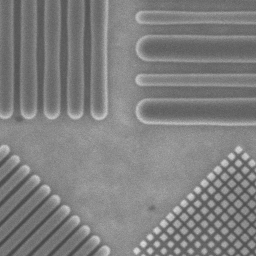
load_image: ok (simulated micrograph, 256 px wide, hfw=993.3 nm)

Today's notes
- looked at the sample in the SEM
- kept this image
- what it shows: groups of lines, slits or small figures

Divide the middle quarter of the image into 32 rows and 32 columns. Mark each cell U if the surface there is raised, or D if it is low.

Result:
DUUUUDDUUUUDDDDDDDDDDDDDDDDDDDDD
DUUUUDDUUUUDDDDDDDDDDDDDDDDDDDDD
DUUUUDDUUUUDDDDDDDDDDDDDDDDDDDDD
DUUUUDDUUUUDDDDDDDUUUUUUUUUUUUUU
DUUUUDDUUUUDDDDDDDUUUUUUUUUUUUUU
DUUUUDDUUUUDDDDDDDDDDDDDDDDDDDDD
DUUUUDDUUUUDDDDDDDDDDDDDDDDDDDDD
DUUUUDDUUUUDDDDDDDDDDDDDDDDDDDDD
DUUUUDDUUUUDDDDDDDDDDDDDDDDDDDDD
DUUUUDDUUUUDDDDDDDDUUUUUUUUUUUUU
DUUUUDDUUUUDDDDDDDUUUUUUUUUUUUUU
DUUUUDDUUUUDDDDDDDUUUUUUUUUUUUUU
DUUUUDDUUUUDDDDDDDUUUUUUUUUUUUUU
DDUDDDDDUUDDDDDDDDDUUUUUUUUUUUUU
DDDDDDDDDDDDDDDDDDDDUUUUUUUUUUUU
DDDDDDDDDDDDDDDDDDDDDDDDDDDDDDDD
DDDDDDDDDDDDDDDDDDDDDDDDDDDDDDDD
DDDDDDDDDDDDDDDDDDDDDDDDDDDDDDDD
DDDDDDDDDDDDDDDDDDDDDDDDDDDDDDDD
DDDDDDDDDDDDDDDDDDDDDDDDDDDDDDDD
DDDDDDDDDDDDDDDDDDDDDDDDDDDDDDDD
DDDDDDDDDDDDDDDDDDDDDDDDDDDDDDDD
DDDDDDDDDDDDDDDDDDDDDDDDDDDDDDDD
DDDDDDDDDDDDDDDDDDDDDDDDDDDDDDDD
DDDDDDDDDDDDDDDDDDDDDDDDDDDDDDDD
DDDDDDDDDDDDDDDDDDDDDDDDDDDDDDDD
DDDDDDDDDDDDDDDDDDDDDDDDDDDDDDDD
DDDDDDDDDDDDDDDDDDDDDDDDDDDDDDDD
DDDDDDDDDDDDDDDDDDDDDDDDDDDDDDDD
DDDDDDDDDDDDDDDDDDDDDDDDDDDDDDDD
DDDDDDDDDDDDDDDDDDDDDDDDDDDDDDDD
DDDDDDDDDDDDDDDDDDDDDDDDDDDDDDDD